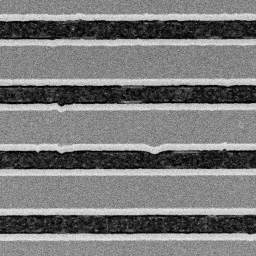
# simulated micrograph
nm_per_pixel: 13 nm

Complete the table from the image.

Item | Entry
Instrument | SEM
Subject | one or a few lines or trenches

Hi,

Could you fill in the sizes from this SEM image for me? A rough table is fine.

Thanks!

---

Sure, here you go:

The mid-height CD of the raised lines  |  514 nm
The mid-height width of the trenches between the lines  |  324 nm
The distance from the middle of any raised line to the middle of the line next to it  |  0.844 microns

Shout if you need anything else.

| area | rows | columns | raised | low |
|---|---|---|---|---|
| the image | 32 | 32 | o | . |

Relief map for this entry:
oooooooooooooooooooooooooooooooo
oooooooooooooooooooooooooooooooo
................................
................................
................................
oooooooooooooooooooooooooooooooo
oooooooooooooooooooooooooooooooo
oooooooooooooooooooooooooooooooo
oooooooooooooooooooooooooooooooo
oooooooooooooooooooooooooooooooo
................................
................................
................................
ooooooo..ooooooooooooooooooooooo
oooooooooooooooooooooooooooooooo
oooooooooooooooooooooooooooooooo
oooooooooooooooooooooooooooooooo
oooooooooooooooooooooooooooooooo
.......oo.........ooo...........
................................
................................
..........................o..ooo
oooooooooooooooooooooooooooooooo
oooooooooooooooooooooooooooooooo
oooooooooooooooooooooooooooooooo
oooooooooooooooooooooooooooooooo
................................
................................
................................
................................
oooooooooooooooooooooooooooooooo
oooooooooooooooooooooooooooooooo